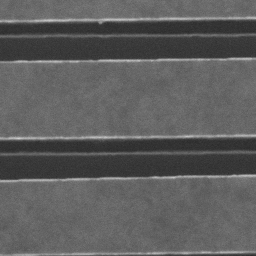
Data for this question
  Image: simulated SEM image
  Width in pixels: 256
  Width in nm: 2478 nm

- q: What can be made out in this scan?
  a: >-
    lines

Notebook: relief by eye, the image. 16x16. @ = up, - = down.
@@@@@@@@@@@@@@@@
----------------
----------------
----------------
@@@@@@@@@@@@@@@@
@@@@@@@@@@@@@@@@
@@@@@@@@@@@@@@@@
@@@@@@@@@@@@@@@@
@@@@@@@@@@@@@@--
----------------
----------------
@@@@@@@@@@@@@@@@
@@@@@@@@@@@@@@@@
@@@@@@@@@@@@@@@@
@@@@@@@@@@@@@@@@
@@@@@@@@@@@@@@@@